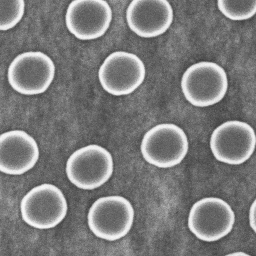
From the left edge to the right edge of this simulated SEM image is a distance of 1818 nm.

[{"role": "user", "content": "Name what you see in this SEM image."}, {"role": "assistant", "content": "a regular array of raised bodies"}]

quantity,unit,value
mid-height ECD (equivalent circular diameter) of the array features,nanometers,291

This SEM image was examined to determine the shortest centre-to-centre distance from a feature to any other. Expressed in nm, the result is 463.